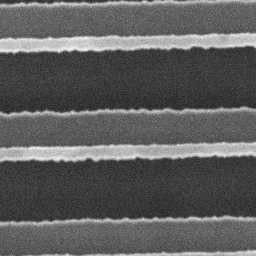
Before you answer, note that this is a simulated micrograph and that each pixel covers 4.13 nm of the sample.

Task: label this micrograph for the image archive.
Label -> lines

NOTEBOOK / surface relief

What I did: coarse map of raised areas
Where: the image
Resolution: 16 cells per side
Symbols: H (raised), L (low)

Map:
HHHHHHHHHHHHHHHH
HHHHHHHHHHHHHHHH
HHHHHHHHHHHHHHHH
LLLLLLLLLLLLLLLL
LLLLLLLLLLLLLLLL
LLLLLLLLLLLLLLLL
LLLLLLLLLLLLLLLL
HHHHHHHHHHHHHHHH
HHHHHHHHHHHHHHHH
HHHHHHHHHHHHHHHH
LLLLLLLLLLLLLLLL
LLLLLLLLLLLLLLLL
LLLLLLLLLLLLLLLL
LLLLLLLLLLLLLLLL
HHHHHHHHHHHHHHHH
HHHHHHHHHHHHHHHH